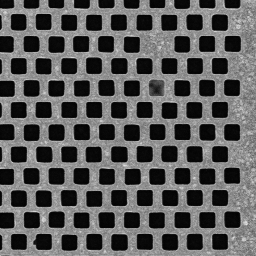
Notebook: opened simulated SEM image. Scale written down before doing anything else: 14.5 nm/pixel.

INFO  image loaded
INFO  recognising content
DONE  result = a regular array of holes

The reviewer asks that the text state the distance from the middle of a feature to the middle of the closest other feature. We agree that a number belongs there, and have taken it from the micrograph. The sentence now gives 358 nanometres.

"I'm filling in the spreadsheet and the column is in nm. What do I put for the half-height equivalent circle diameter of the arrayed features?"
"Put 260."